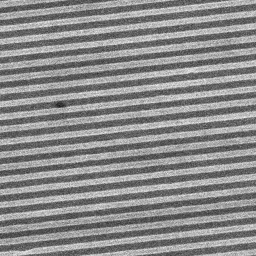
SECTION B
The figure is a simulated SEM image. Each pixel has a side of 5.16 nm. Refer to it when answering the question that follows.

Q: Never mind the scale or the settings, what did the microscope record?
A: parallel lines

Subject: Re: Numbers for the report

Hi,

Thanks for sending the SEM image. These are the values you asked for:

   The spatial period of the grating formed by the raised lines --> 64.4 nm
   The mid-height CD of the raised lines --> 0.0282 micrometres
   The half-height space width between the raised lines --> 0.0372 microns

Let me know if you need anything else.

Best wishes